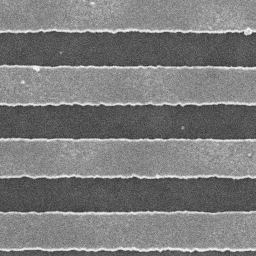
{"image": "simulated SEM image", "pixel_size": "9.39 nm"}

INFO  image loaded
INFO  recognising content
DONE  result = lines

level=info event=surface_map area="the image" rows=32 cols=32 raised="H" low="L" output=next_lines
HHHHHHHHHHHHHHHHHHHHHHHHHHHHHHHH
HHHHHHHHHHHHHHHHHHHHHHHHHHHHHHHH
HHHHHHHHHHHHHHHHHHHHHHHHHHHHHHHH
HHHHHHHHHHHHHHHHHHHHHHHHHHHHHHHH
LLLLLLLLLLLLLLLLLLLLLLLLLLLLLLLL
LLLLLLLLLLLLLLLLLLLLLLLLLLLLLLLL
LLLLLLLLLLLLLLLLLLLLLLLLLLLLLLLL
LLLLLLLLLLLLLLLLLLLLLLLLLLLLLLLL
HHHHHHHHHHHHHHHHHHHHHHHHHHHHHHHH
HHHHHHHHHHHHHHHHHHHHHHHHHHHHHHHH
HHHHHHHHHHHHHHHHHHHHHHHHHHHHHHHH
HHHHHHHHHHHHHHHHHHHHHHHHHHHHHHHH
HHHHHHHHHHHHHHHHHHHHHHHHHHHHHHHH
LLLLLLLLLLLLLLLLLLLLLLLLLLLLLLLL
LLLLLLLLLLLLLLLLLLLLLLLLLLLLLLLL
LLLLLLLLLLLLLLLLLLLLLLLLLLLLLLLL
LLLLLLLLLLLLLLLLLLLLLLLLLLLLLLLL
HHHHHHHHHHHHHHHHLHHHHHHHHHHLLLLH
HHHHHHHHHHHHHHHHHHHHHHHHHHHHHHHH
HHHHHHHHHHHHHHHHHHHHHHHHHHHHHHHH
HHHHHHHHHHHHHHHHHHHHHHHHHHHHHHHH
HHHHHHHHHHHHHHHHHHHHHHHHHHHHHHHH
LLLLLLLLLLLLLLLLLLLLLLLLLLLLLLLL
LLLLLLLLLLLLLLLLLLLLLLLLLLLLLLLL
LLLLLLLLLLLLLLLLLLLLLLLLLLLLLLLL
LLLLLLLLLLLLLLLLLLLLLLLLLLLLLLLL
LLLLLLLLLLLLLLLLLLLHLLHHLLLLLLLL
HHHHHHHHHHHHHHHHHHHHHHHHHHHHHHHH
HHHHHHHHHHHHHHHHHHHHHHHHHHHHHHHH
HHHHHHHHHHHHHHHHHHHHHHHHHHHHHHHH
HHHHHHHHHHHHHHHHHHHHHHHHHHHHHHHH
LLLLLLLLLLLLLLLLLLLLLLLLLLLLLLLL